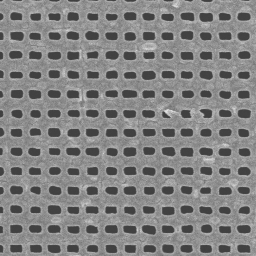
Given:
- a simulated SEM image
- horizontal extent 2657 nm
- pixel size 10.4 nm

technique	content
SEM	a regular array of holes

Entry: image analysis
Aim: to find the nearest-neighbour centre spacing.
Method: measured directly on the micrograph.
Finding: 0.191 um